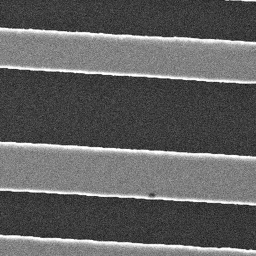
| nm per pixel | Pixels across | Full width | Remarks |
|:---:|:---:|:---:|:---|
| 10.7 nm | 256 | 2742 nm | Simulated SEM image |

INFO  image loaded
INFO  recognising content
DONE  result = lines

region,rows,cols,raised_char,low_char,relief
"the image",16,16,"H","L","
LLLLLLLLLLLLLLLL
LLLLLLLLLLLLLLLL
HHHHHHHHHHHHHHLL
HHHHHHHHHHHHHHHH
LLLLHHHHHHHHHHHH
LLLLLLLLLLLLLLLL
LLLLLLLLLLLLLLLL
LLLLLLLLLLLLLLLL
LLLLLLLLLLLLLLLL
HHHHHHHHHHLLLLLL
HHHHHHHHHHHHHHHH
HHHHHHHHHHHHHHHH
LLLLLLLLLLLHHHHH
LLLLLLLLLLLLLLLL
LLLLLLLLLLLLLLLL
HHHHHHHHHHHHHLLL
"